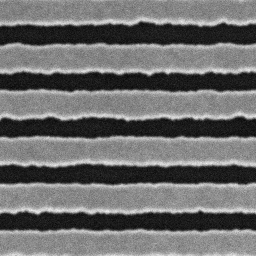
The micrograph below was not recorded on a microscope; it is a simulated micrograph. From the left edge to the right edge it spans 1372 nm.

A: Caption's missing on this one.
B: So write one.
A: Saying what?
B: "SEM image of lines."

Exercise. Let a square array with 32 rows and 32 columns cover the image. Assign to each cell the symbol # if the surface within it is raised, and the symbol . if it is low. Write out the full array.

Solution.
################################
################################
################################
................................
................................
.##.........#..............##...
################################
################################
################################
................................
................................
########.############.#####.####
################################
################################
################################
................................
................................
################################
################################
################################
##########...###################
................................
................................
################################
################################
################################
##..#.##################..######
................................
................................
################################
################################
################################